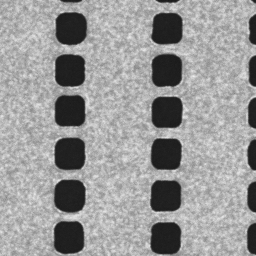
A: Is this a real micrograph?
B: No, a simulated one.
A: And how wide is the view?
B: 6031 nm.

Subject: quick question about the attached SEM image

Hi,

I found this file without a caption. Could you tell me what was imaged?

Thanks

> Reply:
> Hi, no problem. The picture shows a regular array of holes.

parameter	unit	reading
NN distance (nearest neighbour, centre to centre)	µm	0.984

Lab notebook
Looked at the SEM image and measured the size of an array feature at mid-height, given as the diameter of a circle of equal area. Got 803 nm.